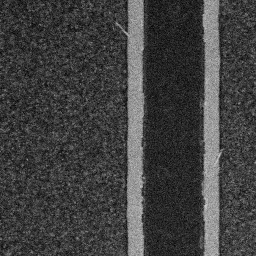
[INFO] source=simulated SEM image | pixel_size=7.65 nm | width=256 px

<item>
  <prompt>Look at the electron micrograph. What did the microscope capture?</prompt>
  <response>one or a few lines or trenches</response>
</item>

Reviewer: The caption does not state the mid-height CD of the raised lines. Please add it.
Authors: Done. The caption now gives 577 nm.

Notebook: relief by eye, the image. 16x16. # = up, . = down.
.........####...
.........####...
.........####...
........#####...
........#####...
.........####...
.........####...
.........####...
........#####...
........#####...
........#####...
........#####...
........#####...
........#####...
........#####...
.........####...